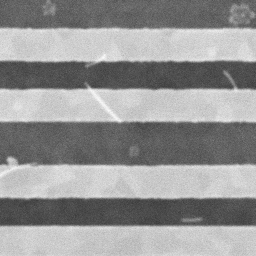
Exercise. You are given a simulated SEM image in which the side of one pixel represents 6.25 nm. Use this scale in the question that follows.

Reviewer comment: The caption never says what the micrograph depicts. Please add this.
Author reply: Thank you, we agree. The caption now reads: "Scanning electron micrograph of lines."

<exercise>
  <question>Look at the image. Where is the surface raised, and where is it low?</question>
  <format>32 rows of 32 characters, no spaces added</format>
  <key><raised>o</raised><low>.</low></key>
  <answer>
................................
................................
................................
................................
oooooooooooooooooooooooooooooooo
oooooooooooooooooooooooooooooooo
oooooooooooooooooooooooooooooooo
oooooooooooooooooooooooooooooooo
................................
................................
................................
oooooooooooooooooooooooooooooooo
oooooooooooooooooooooooooooooooo
oooooooooooooooooooooooooooooooo
oooooooooooooooooooooooooooooooo
................................
................................
................................
................................
................................
................................
oooooooooooooooooooooooooooooooo
oooooooooooooooooooooooooooooooo
oooooooooooooooooooooooooooooooo
oooooooooooooooooooooooooooooooo
................................
................................
................................
oooooooooooooooooooooooooooooooo
oooooooooooooooooooooooooooooooo
oooooooooooooooooooooooooooooooo
oooooooooooooooooooooooooooooooo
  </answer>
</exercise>